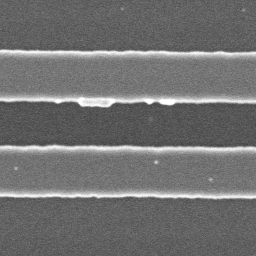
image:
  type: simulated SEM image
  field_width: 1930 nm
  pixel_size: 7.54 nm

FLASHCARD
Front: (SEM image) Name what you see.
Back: lines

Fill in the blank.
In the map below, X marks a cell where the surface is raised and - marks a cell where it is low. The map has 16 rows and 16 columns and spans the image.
----------------
----------------
----------------
XXXXXXXXXXXXXXXX
XXXXXXXXXXXXXXXX
XXXXXXXXXXXXXXXX
-----XX---X-----
----------------
----------------
XXXXXXXXXXXXXXXX
XXXXXXXXXXXXXXXX
XXXXXXXXXXXXXXXX
----------------
----------------
----------------
----------------